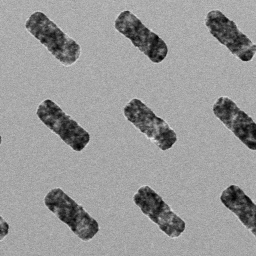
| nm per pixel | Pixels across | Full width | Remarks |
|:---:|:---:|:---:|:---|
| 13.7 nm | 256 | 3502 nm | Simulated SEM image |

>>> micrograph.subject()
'holes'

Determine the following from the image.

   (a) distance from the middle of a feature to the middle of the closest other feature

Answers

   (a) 1200 nm